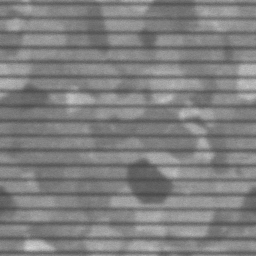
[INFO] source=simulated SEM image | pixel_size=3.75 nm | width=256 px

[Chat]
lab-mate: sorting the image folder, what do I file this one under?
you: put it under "parallel lines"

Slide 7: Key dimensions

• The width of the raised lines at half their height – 10.6 px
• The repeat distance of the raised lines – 55 nm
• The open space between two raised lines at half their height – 13.1 nanometres